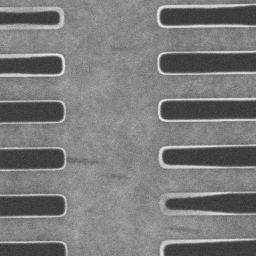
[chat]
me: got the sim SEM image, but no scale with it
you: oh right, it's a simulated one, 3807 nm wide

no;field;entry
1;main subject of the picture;groups of lines, slits or small figures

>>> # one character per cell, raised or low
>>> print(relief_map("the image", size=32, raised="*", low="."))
................................
********............************
********............************
................................
................................
................................
................................
********............************
********............************
................................
................................
................................
.....................***********
********............************
********............************
................................
................................
................................
.....................***********
********............************
********............************
................................
................................
................................
.*******..............**********
********............************
********.............***********
................................
................................
................................
********.............***********
********............************